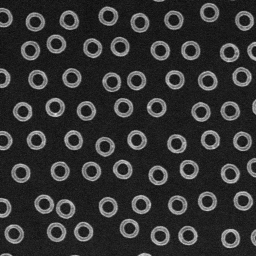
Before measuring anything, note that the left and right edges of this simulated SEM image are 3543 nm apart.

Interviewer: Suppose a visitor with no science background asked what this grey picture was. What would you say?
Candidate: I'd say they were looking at a regular array of ring-shaped raised bodies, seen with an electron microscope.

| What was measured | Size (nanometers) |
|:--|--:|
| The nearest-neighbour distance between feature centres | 409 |